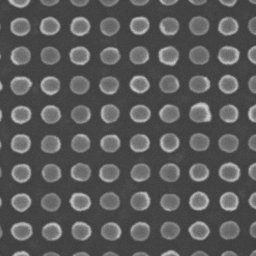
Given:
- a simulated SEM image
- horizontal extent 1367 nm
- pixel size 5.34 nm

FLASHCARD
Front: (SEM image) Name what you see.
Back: a regular array of raised bodies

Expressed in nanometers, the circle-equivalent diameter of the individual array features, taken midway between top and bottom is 99.8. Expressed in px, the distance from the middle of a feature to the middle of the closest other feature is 29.